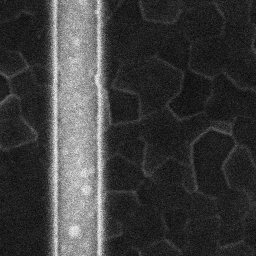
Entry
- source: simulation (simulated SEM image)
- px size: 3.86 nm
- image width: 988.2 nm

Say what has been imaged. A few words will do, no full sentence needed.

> one or a few lines or trenches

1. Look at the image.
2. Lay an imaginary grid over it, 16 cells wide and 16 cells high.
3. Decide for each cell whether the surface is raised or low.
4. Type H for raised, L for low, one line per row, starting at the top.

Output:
HHHLLLHHHHHHHHHH
HHHLLLHHHHHHHHHH
HHHLLLHHHHHHHHHH
HHHLLLHHHHHHHHHH
HHHLLLHHHHHHHHHH
HHHLLLHHHHHHHHHH
HHHLLLHHHHHHHHHH
HHHLLLHHHHHHHHHH
HHHLLLHHHHHHHHHH
HHHLLLHHHHHHHHHH
HHHHLLHHHHHHHHHH
HHHHLLHHHHHHHHHH
HHHHLLHHHHHHHHHH
HHHHLLHHHHHHHHHH
HHHHLLHHHHHHHHHH
HHHHLLHHHHHHHHHH